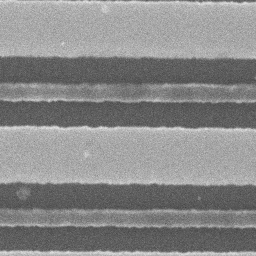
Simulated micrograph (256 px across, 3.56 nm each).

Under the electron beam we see lines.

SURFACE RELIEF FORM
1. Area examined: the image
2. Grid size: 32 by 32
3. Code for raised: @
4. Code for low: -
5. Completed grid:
@@@@@@@@@@@@@@@@@@@@@@@@@@@@@@@@
@@@@@@@@@@@@@@@@@@@@@@@@@@@@@@@@
@@@@@@@@@@@@@@@@@@@@@@@@@@@@@@@@
@@@@@@@@@@@@@@@@@@@@@@@@@@@@@@@@
@@@@@@@@@@@@@@@@@@@@@@@@@@@@@@@@
@@@@@@@@@@@@@@@@@@@@@@@@@@@@@@@@
@@@@@@@@@@@@@@@@@@@@@@@@@@@@@@@@
--------------------------------
--------------------------------
--------------------------------
--------------------------------
@@@@@@@@@@@@@@@@@@@@@@@@@@@@@@@@
-@@@@@@-@@@@@@@@@@@@@@@@@@@@@@@@
--------------------------------
--------------------------------
--------------------------------
@@@@@@@@@@@@@@@@@@@@@@@@@@@@@@@@
@@@@@@@@@@@@@@@@@@@@@@@@@@@@@@@@
@@@@@@@@@@@@@@@@@@@@@@@@@@@@@@@@
@@@@@@@@@@@@@@@@@@@@@@@@@@@@@@@@
@@@@@@@@@@@@@@@@@@@@@@@@@@@@@@@@
@@@@@@@@@@@@@@@@@@@@@@@@@@@@@@@@
@@@@@@@@@@@@@@@@@@@@@@@@@@@@@@@@
--------------------------------
--------------------------------
--------------------------------
@@@-@@@@@@@@@@@@@@@@@@@@@@@@@-@-
@@@@@@@@@@@@@@@@@@@@@@@@@@@@@@@@
--------------------------------
--------------------------------
--------------------------------
@@@@@-------@-------------------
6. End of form